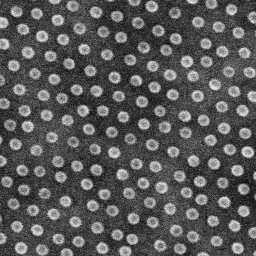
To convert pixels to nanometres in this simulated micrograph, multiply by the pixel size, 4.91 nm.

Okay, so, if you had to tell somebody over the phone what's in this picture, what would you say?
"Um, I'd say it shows a regular array of raised bodies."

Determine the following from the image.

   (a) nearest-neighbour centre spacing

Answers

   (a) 19.2 px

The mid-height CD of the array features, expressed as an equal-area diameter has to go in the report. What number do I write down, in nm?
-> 51.1